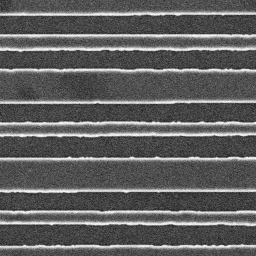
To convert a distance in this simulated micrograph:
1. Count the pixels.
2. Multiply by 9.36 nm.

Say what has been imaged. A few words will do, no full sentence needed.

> lines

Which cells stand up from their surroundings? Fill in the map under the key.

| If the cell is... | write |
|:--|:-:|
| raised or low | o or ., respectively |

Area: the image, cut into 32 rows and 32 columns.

oooooooooooooooooooooooooooooooo
oooooooooooooooooooooooooooooooo
................................
................................
oooooooooooooooooooooooooooooooo
oooooooooooooooooooooooooooooooo
................................
................................
................................
oooooooooooooooooooooooooooooooo
oooooooooooooooooooooooooooooooo
oooooooooooooooooooooooooooooooo
oooooooooooooooooooooooooooooooo
................................
................................
oooooooooooooooooooooooooooooooo
oooooooooooooooooooooooooooooooo
................................
................................
................................
oooooooooooooooooooooooooooooooo
oooooooooooooooooooooooooooooooo
oooooooooooooooooooooooooooooooo
oooooooooooooooooooooooooooooooo
................................
................................
ooooooooooooooooooooooooo....ooo
oooooooooooooooooooooooooooooooo
................................
................................
................................
oooooooooooooooooooooooooooooooo